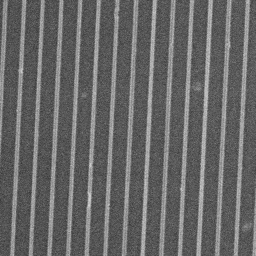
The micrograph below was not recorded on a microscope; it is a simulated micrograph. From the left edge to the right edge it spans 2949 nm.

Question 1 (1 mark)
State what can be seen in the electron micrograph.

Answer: parallel lines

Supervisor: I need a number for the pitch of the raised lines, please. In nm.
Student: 214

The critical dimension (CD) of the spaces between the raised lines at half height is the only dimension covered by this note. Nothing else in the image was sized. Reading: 0.178 microns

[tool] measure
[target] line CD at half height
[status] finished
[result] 38.8 nm